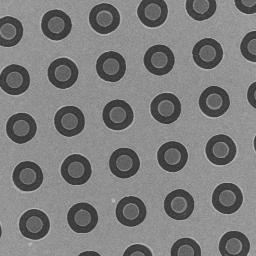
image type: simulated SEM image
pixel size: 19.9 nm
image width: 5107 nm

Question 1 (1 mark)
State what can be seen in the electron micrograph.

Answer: an array of small figures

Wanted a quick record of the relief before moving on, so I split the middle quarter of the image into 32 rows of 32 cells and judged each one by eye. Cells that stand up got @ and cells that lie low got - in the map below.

---@@@@@--@@@@--@@@@---@@--@@@@@
@---@@@@--@@@@--@@@@@------@@@@@
@@--@@@@---@---@@@@@@@----@@@@@@
@--@@@@@@------@@@@@@@@@@@@@@@@@
---@@@@@@@@--@@@@@@@@@@@@@@@@@@@
--@@@@@@@@@@@@@@@@@@@@@@@@@@@@@@
@@@@@@@@@@@@@@@@@@@@@@@@@@@@@@@@
@@@@@@@@@@@@@@@@@@@@@@@@---@@@@@
@@@@@@@@@@@@@@@@@@@@@@@------@@@
@@@@@@@@@@@-----@@@@@@---@---@@@
--@@@@@@@@------@@@@@---@@@--@@@
----@@@@@@--@@@--@@@@---@@@--@@@
-@---@@@@---@@@---@@@@--@@@--@@@
@@@--@@@@@--@@@---@@@@-------@@@
@@@--@@@@@---@---@@@@@@@----@@@@
@@@--@@@@@------@@@@@@@@@@@@@@@@
-----@@@@@@@---@@@@@@@@@@@@@@@@@
----@@@@@@@@@@@@@@@@@@@@@@@@@@@@
@@@@@@@@@@@@@@@@@@@@@@@@@@@@@@@@
@@@@@@@@@@@@@@@@@@@@@@@@@@--@@@@
@@@@@@@@@@@@@@@@@@@@@@@@------@@
@@@@@@@@@@@@@----@@@@@@---@@---@
@@--@@@@@@@@------@@@@@--@@@@--@
@-----@@@@@---@@@--@@@@--@@@@--@
------@@@@@--@@@@--@@@@---@@---@
-@@@@--@@@@--@@@@--@@@@@------@@
-@@@@--@@@@@--@@---@@@@@@----@@@
-@@@@--@@@@@------@@@@@@@@@@@@@@
-------@@@@@@@--@@@@@@@@@@@@@@@@
@-----@@@@@@@@@@@@@@@@@@@@@@@@@@
@@@@@@@@@@@@@@@@@@@@@@@@@@@@@@@@
@@@@@@@@@@@@@@@@@@@@@@@@@@@@--@@